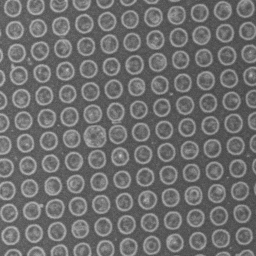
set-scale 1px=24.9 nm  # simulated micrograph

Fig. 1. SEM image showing a regular array of raised bodies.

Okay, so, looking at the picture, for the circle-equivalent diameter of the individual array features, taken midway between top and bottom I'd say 422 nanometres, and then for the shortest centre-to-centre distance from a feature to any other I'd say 562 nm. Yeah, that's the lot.